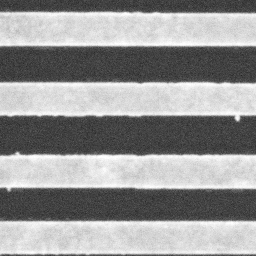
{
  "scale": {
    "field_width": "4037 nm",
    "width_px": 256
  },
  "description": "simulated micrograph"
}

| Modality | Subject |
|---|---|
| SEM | lines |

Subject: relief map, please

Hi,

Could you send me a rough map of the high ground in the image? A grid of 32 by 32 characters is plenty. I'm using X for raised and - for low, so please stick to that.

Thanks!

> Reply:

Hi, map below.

--------------------------------
--------------------------------
XXXXXXXXXXXXXXXXXXXXXXXXXXXXXXXX
XXXXXXXXXXXXXXXXXXXXXXXXXXXXXXXX
XXXXXXXXXXXXXXXXXXXXXXXXXXXXXXXX
XXXXXXXXXXXXXXXXXXXXXXXXXXXXXXXX
--------------------------------
--------------------------------
--------------------------------
--------------------------------
XXXXXXXX--XXXXXX--XXX--XX-X-----
XXXXXXXXXXXXXXXXXXXXXXXXXXXXXXXX
XXXXXXXXXXXXXXXXXXXXXXXXXXXXXXXX
XXXXXXXXXXXXXXXXXXXXXXXXXXXXXXXX
--------------------------------
--------------------------------
--------------------------------
--------------------------------
--------------------------------
----X----------X----XXX-X----X--
XXXXXXXXXXXXXXXXXXXXXXXXXXXXXXXX
XXXXXXXXXXXXXXXXXXXXXXXXXXXXXXXX
XXXXXXXXXXXXXXXXXXXXXXXXXXXXXXXX
--------------------------------
--------------------------------
--------------------------------
--------------------------------
--------------------------------
XXXXXXXXXXXXXXXXXXXXXXXXXXXXXXXX
XXXXXXXXXXXXXXXXXXXXXXXXXXXXXXXX
XXXXXXXXXXXXXXXXXXXXXXXXXXXXXXXX
XXXXXXXXXXXXXXXXXXXXXXXXXXXXXXXX